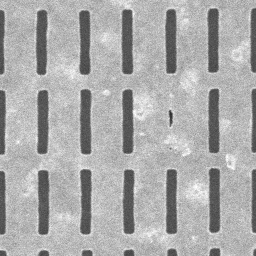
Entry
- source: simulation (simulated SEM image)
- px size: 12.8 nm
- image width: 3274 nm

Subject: a regular array of holes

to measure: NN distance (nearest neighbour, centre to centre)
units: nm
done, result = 545